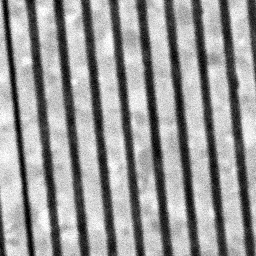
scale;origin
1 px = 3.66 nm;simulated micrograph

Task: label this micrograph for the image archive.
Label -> parallel lines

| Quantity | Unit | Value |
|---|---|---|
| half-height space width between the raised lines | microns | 0.036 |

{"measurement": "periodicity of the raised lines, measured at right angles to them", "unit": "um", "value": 0.101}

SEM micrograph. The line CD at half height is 0.0646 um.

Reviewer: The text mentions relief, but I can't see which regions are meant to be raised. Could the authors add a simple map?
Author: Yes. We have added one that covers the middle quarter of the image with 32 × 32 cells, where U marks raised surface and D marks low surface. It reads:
DDUUUUDDDUUUUDDUUUUUDDUUUUUDDUUU
DDUUUUDDDUUUUDDUUUUUDDUUUUUDDUUU
DDUUUUDDDUUUUDDDUUUUDDUUUUUDDUUU
DDUUUUDDDUUUUDDDUUUUDDDUUUUDDUUU
DDUUUUDDDUUUUDDDUUUUDDDUUUUDDDUU
DDUUUUDDDUUUUDDDUUUUDDDUUUUDDDUU
DDUUUUDDDUUUUDDDUUUUDDDUUUUDDDUU
DDUUUUUDDUUUUDDDUUUUDDDUUUUDDDUU
DDUUUUUDDDUUUUDDUUUUDDDUUUUDDDUU
DDDUUUUDDDUUUUDDUUUUUDDUUUUDDDUU
DDDUUUUDDDUUUUDDUUUUUDDUUUUUDDUU
DDDUUUUDDDUUUUDDDUUUUDDUUUUUDDUU
DDDUUUUDDDUUUUDDDUUUUDDDUUUUDDUU
DDDUUUUDDDUUUUDDDUUUUDDDUUUUDDDU
DDDUUUUDDDUUUUDDDUUUUDDDUUUUDDDU
DDDUUUUDDDUUUUDDDUUUUDDDUUUUDDDU
UDDUUUUUDDUUUUDDDUUUUDDDUUUUDDDU
UDDUUUUUDDUUUUUDDUUUUDDDUUUUDDDU
UDDUUUUUDDUUUUUDDUUUUUDDUUUUDDDU
UDDDUUUUDDUUUUUDDUUUUUDDUUUUUDDU
UDDDUUUUDDDUUUUDDUUUUUDDUUUUUDDU
UDDDUUUUDDDUUUUDDDUUUUDDUUUUUDDU
UDDDUUUUDDDUUUUDDDUUUUDDDUUUUDDD
UDDDUUUUDDDUUUUDDDUUUUDDDUUUUDDD
UDDDUUUUDDDUUUUDDDUUUUDDDUUUUDDD
UUDDUUUUDDDUUUUDDDUUUUDDDUUUUDDD
UUDDDUUUUDDUUUUDDDUUUUDDDUUUUDDD
UUDDDUUUUDDUUUUUDDUUUUDDDUUUUDDD
UUDDDUUUUDDDUUUUDDUUUUUDDUUUUUDD
UUDDDUUUUDDDUUUUDDUUUUUDDUUUUUDD
UUDDDUUUUDDDUUUUDDDUUUUDDUUUUUDD
UUDDDUUUUDDDUUUUDDDUUUUDDDUUUUDD